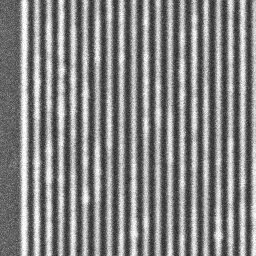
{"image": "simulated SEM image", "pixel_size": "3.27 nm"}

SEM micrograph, parallel lines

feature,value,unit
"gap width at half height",0.0274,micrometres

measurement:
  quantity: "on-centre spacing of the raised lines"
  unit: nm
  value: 39.5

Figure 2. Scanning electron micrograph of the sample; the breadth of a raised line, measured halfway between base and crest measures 12.3 nanometers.